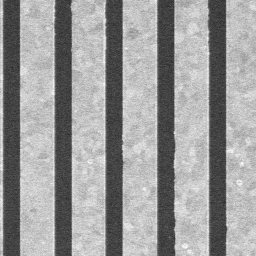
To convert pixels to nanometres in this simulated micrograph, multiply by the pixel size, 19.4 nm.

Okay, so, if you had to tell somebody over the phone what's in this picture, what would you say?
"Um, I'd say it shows lines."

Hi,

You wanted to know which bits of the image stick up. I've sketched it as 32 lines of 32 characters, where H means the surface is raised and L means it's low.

LLLHHHHLLHHHHLLHHHHHLLHHHHLLHHHH
LLLHHHHLLHHHHLLHHHHHLLHHHHLLHHHH
LLLHHHHLLHHHHLLHHHHHLLHHHHLLHHHH
LLLHHHHLLHHHHLLHHHHHLLHHHHLLHHHH
LLLHHHHLLHHHHLLHHHHHLLHHHHLLHHHH
LLLHHHHLLHHHHLLHHHHHLLHHHHLLHHHH
LLLHHHHLLHHHHLLHHHHHLLHHHHLLHHHH
LLLHHHHLLHHHHLLHHHHHLLHHHHLLHHHH
LLLHHHHLLHHHHLLHHHHHLLHHHHLLHHHH
LLLHHHHLLHHHHLLHHHHHLLHHHHLLHHHH
LLLHHHHLLHHHHLLHHHHHLLHHHHLLHHHH
LLLHHHHLLHHHHLLHHHHHLLHHHHLLHHHH
LLLHHHHLLHHHHLLHHHHHLLHHHHLLHHHH
LLLHHHHLLHHHHLLHHHHHLLHHHHLLHHHH
LLLHHHHLLHHHHLLHHHHHLLHHHHLLHHHH
LLLHHHHLLHHHHLLHHHHHLLHHHHLLHHHH
LLLHHHHLLHHHHLLHHHHHLLHHHHLLHHHH
LLLHHHHLLHHHHLLHHHHHLLHHHHLLHHHH
LLLHHHHLLHHHHLLHHHHHLLHHHHLLHHHH
LLLHHHHLLHHHHLLHHHHHLLHHHHLLHHHH
LLLHHHHLLHHHHLLLHHHHLLHHHHLLHHHH
LLLHHHHLLHHHHLLHHHHHLLHHHHLLHHHH
LLLHHHHLLHHHHLLHHHHHLLHHHHLLHHHH
LLLHHHHLLHHHHLLHHHHHLLHHHHLLHHHH
LLLHHHHLLHHHHLLHHHHHLLHHHHLLHHHH
LLLHHHHLLHHHHLLHHHHHLLHHHHLLHHHH
LLLHHHHLLHHHHLLHHHHHLLHHHHLLHHHH
LLLHHHHLLHHHHLLHHHHHLLHHHHLLHHHH
LLLHHHHLLHHHHLLHHHHHLLHHHHLLHHHH
LLLHHHHLLHHHHLLHHHHHLLHHHHLLHHHH
LLLHHHHLLHHHHLLHHHHHLLHHHHLLHHHH
LLLHHHHLLHHHHLLHHHHHLLHHHHLLHHHH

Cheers